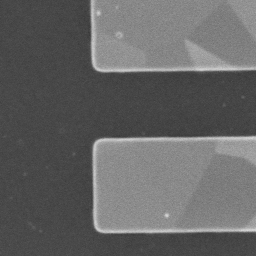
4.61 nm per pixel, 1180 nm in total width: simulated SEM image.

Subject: wiring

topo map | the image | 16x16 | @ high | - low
------@@@@@@@@@@
------@@@@@@@@@@
------@@@@@@@@@@
------@@@@@@@@@@
----------------
----------------
----------------
----------------
----------------
------@@@@@@@@@@
------@@@@@@@@@@
------@@@@@@@@@@
------@@@@@@@@@@
------@@@@@@@@@@
------@@@@------
----------------